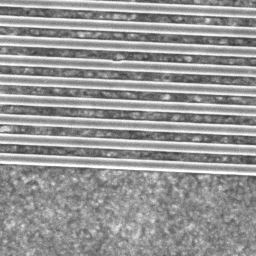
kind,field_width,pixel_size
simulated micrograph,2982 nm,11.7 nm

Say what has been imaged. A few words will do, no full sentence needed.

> parallel lines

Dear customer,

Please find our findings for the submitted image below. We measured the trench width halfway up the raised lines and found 118 nanometres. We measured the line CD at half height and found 109 nanometres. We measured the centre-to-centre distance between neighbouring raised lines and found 228 nm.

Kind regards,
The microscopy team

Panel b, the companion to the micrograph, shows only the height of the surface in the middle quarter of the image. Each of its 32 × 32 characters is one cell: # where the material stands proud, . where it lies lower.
################################
.............###################
................................
................................
##################.###..........
################################
...............#################
................................
####............................
#########################.......
################################
..................##############
................................
##..............................
#######################.........
################################
....................############
................................
####............................
#########################.......
..##############################
.......................#########
................................
#######.........................
############################....
....############################
.........................#######
................................
................................
................................
................................
................................